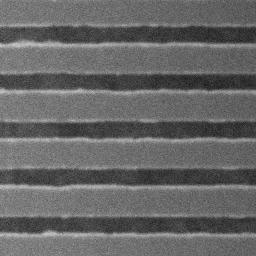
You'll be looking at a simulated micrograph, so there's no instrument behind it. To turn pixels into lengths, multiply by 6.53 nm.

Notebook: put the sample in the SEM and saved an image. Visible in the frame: lines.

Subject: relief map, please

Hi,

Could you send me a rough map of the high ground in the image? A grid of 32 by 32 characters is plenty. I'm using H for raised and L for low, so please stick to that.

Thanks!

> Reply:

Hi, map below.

HHHHHHHHHHHHHHHHHHHHHHHHHHHHHHHH
HHHHHHHHHHHHHHHHHHHHHHHHHHHHHHHH
HHHHHHHHHHHHHHHHHHHHHHHHHHHHHHHH
LLLLLLLLLLLLLLLLLLLLLLLLLLLLLLLL
LLLLLLLLLLLLLLLLLLLLLLLLLLLLLLLL
LLHHHLLLLLLLLHHHHHHLLHHHHHLLLLLL
HHHHHHHHHHHHHHHHHHHHHHHHHHHHHHHH
HHHHHHHHHHHHHHHHHHHHHHHHHHHHHHHH
HHHHHHHHHHHHHHHHHHHHHHHHHHHHHHHH
LLLLLLLLLLLLLLLLLLLLLLLLLLLLLLLL
LLLLLLLLLLLLLLLLLLLLLLLLLLLLLLLL
HHHHHHHHHHHHHHHHHHHHHHHHHHHHHHHH
HHHHHHHHHHHHHHHHHHHHHHHHHHHHHHHH
HHHHHHHHHHHHHHHHHHHHHHHHHHHHHHHH
HHHHHHHHHHHHHHHHHHHHHHHHHHHHHHHH
LLLLLLLLLLLLLLLLLLLLLLLLLLLLLLLL
LLLLLLLLLLLLLLLLLLLLLLLLLLLLLLLL
HHHHHHHHHHHHHHHHHHHHHHHHHHHHHHHH
HHHHHHHHHHHHHHHHHHHHHHHHHHHHHHHH
HHHHHHHHHHHHHHHHHHHHHHHHHHHHHHHH
HHHHHHHHHHHHHHHHHHHHHHHHHHHHHHHH
LLLLLLLLLLLLLLLLLLLLLLLLLLLLLLLL
LLLLLLLLLLLLLLLLLLLLLLLLLLLLLLLL
HHHHHHHHHHHHHHHHHHHHHHHHHHHHHHHH
HHHHHHHHHHHHHHHHHHHHHHHHHHHHHHHH
HHHHHHHHHHHHHHHHHHHHHHHHHHHHHHHH
HHHHHHHHHHHHHHHHHHHHHHHHHHHHHHHH
LLLLLLLLLLLLLLLLLLLLLLLLLLLLLLLL
LLLLLLLLLLLLLLLLLLLLLLLLLLLLLLLL
HHHHHHHHHHHHHHHHHHHHHHHHHHHHHHHH
HHHHHHHHHHHHHHHHHHHHHHHHHHHHHHHH
HHHHHHHHHHHHHHHHHHHHHHHHHHHHHHHH